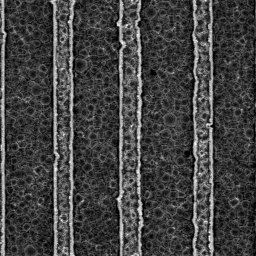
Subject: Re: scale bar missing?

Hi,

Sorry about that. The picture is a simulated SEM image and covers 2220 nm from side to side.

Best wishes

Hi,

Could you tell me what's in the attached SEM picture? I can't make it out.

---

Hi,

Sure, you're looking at one or a few lines or trenches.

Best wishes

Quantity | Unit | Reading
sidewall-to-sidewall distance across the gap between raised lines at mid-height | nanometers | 441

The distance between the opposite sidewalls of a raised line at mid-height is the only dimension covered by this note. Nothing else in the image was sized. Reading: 157 nanometres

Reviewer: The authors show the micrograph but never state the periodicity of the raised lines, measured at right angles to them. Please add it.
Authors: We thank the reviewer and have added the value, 607 nanometres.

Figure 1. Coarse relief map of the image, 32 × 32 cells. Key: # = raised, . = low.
.......##......###......##......
.......##......##.......##......
.......##......##.......##......
.......##......##.......##......
#......##......##.......##......
#......##......##.......##......
.......##......##.......##......
.......##......###......##......
.......##......##.......###.....
.......##......##.......###.....
.......##......###......##......
.......##......###......##......
.......##......###......##......
.......##......###......###.....
.......##......##.......###.....
.......##......##.......##......
.......##......##.......##......
.......##......##.......##......
.......##......##.......##......
.......##......##.......##......
.......##......##........#......
.......##......##.......###.....
.......##......##.......###.....
.......##......##.......###.....
.......##......##.......##......
.......##......###......###.....
.......##......###......###.....
.......##......###......###.....
.......##......###......##......
.......##......###......##......
.......##......###......###.....
.......##......###......###.....